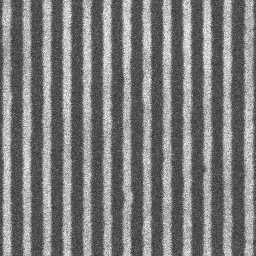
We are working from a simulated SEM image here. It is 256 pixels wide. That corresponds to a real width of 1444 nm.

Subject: parallel lines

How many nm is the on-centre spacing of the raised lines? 114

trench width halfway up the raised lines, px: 13.4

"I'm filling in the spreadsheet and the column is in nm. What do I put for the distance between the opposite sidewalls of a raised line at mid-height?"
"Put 38.1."